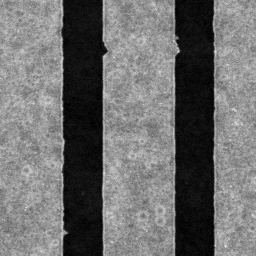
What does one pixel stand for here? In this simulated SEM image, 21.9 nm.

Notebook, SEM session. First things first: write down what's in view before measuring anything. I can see one or a few lines or trenches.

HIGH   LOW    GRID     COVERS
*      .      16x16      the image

****..*****..***
****..*****..***
****..*****..***
****...****..***
****...****..***
****...****..***
****...****...**
****...****..***
****...****..***
****...****..***
****...****..***
****...****..***
****...****..***
****...****..***
****...****..***
****...****..***